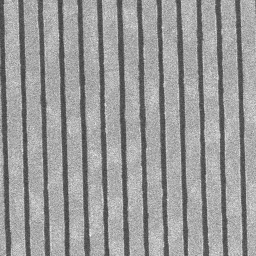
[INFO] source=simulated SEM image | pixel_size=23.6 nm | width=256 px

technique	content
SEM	parallel lines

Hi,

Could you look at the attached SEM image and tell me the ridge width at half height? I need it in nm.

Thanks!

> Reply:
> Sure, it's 325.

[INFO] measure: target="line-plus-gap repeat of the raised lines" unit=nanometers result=466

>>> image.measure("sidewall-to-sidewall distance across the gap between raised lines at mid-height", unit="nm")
130